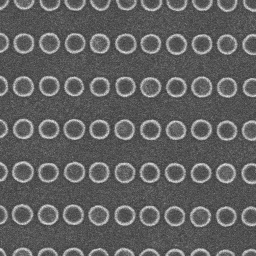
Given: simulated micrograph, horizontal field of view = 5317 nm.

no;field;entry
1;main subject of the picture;a regular array of raised bodies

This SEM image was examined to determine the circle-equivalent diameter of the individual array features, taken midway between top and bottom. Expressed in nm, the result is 392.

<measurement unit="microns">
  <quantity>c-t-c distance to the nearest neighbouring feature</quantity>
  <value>0.521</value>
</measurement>